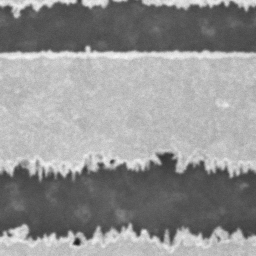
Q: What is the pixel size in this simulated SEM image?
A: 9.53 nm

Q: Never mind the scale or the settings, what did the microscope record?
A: one or a few lines or trenches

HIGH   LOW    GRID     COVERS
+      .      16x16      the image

................
................
................
++++++++++++++++
++++++++++++++++
++++++++++++++++
++++++++++++++++
++++++++++++++++
++++++++++++++++
++++++++++.+++++
+.+++.........++
................
................
................
.+......+.......
++++++++++++++++